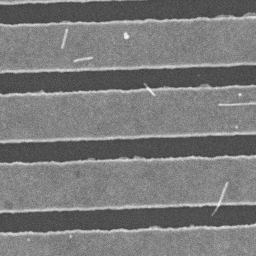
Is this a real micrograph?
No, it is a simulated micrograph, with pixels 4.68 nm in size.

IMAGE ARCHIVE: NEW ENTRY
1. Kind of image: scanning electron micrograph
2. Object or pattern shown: lines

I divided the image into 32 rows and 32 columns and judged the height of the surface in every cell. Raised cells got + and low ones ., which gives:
++..............................
................................
..................++.+++++++++++
++++++++++++++++++++++++++++++++
++++++++++++++++++++++++++++++++
++++++++++++++++++++++++++++++++
++++++++++++++++++++++++++++++++
++++++++++++++++++++++++++++++++
+++++++++++++++++++++...........
................................
................................
.........+++++++++++++++++++++++
++++++++++++++++++++++++++++++++
++++++++++++++++++++++++++++++++
++++++++++++++++++++++++++++++++
++++++++++++++++++++++++++++++++
++++++++++++++++++++++++++++++++
++++++++++......................
................................
............................++++
++++++++++++++++++++++++++++++++
++++++++++++++++++++++++++++++++
++++++++++++++++++++++++++++++++
++++++++++++++++++++++++++++++++
++++++++++++++++++++++++++++++++
++++++++++++++++++++++++++++++++
++++............................
................................
......................++++++++++
++++++++++++++++++++++++++++++++
++++++++++++++++++++++++++++++++
++++++++++++++++++++++++++++++++